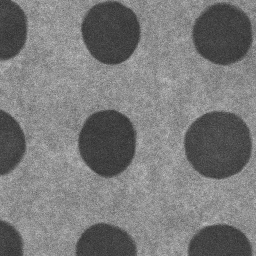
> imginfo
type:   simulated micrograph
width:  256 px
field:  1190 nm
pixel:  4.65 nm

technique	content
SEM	holes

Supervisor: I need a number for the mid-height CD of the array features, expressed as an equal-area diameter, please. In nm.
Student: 288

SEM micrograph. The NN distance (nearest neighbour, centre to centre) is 111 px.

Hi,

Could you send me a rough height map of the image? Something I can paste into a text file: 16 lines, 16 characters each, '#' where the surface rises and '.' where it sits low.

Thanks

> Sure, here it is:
.#####..#####..#
..###....###....
..###....###....
.#####..#####..#
################
################
################
.####...####...#
..###...####....
..###...####....
.#####..####...#
################
################
################
.####...####...#
.####...####....